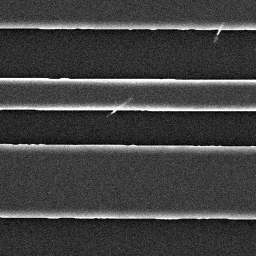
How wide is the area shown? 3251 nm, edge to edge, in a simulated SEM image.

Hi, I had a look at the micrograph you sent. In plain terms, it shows lines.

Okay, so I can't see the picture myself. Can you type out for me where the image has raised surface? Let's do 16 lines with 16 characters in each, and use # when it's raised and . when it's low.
################
################
................
................
................
################
################
................
................
################
################
################
################
################
................
................